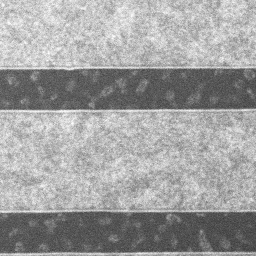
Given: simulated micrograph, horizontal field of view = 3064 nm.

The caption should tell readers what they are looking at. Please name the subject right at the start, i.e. one or a few lines or trenches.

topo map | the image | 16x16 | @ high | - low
@@@@@@@@@@@@@@@@
@@@@@@@@@@@@@@@@
@@@@@@@@@@@@@@@@
@@@@@@@@@@@@@@@@
----------------
----------------
----------------
@@@@@@@@@@@@@@@@
@@@@@@@@@@@@@@@@
@@@@@@@@@@@@@@@@
@@@@@@@@@@@@@@@@
@@@@@@@@@@@@@@@@
@@@@@@@@@@@@@@@@
----------------
----------------
----------------